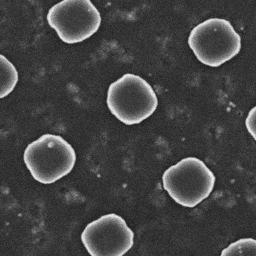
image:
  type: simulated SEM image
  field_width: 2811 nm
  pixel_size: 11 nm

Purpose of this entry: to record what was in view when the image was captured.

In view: raised bodies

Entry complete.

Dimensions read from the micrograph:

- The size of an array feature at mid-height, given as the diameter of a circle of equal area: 520 nm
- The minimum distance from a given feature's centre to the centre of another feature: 1100 nm